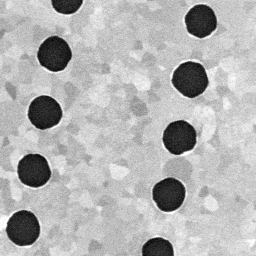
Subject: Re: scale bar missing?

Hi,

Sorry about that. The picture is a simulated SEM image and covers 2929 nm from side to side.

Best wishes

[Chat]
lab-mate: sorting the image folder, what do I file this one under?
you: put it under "a regular array of holes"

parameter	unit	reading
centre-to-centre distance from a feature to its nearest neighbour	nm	673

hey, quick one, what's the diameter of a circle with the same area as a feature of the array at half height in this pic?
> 35 px